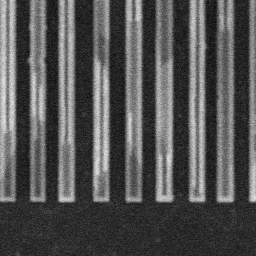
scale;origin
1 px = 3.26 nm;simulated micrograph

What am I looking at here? parallel lines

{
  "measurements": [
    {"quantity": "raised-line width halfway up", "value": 43.6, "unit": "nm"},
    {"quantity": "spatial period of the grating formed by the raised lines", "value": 0.102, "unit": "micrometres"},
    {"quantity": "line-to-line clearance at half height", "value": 0.0595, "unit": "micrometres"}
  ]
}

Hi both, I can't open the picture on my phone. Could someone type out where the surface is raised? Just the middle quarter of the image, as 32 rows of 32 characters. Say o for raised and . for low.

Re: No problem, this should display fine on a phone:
oo......ooo.....ooo.....ooo.....
oo......ooo.....ooo.....ooo.....
oo......ooo.....ooo.....ooo.....
oo......ooo.....ooo.....ooo.....
oo......ooo.....ooo.....ooo.....
oo......ooo.....ooo.....ooo.....
oo......ooo.....ooo.....ooo.....
oo......ooo.....ooo.....ooo.....
oo......ooo.....ooo.....ooo.....
oo......ooo.....ooo.....ooo.....
oo......ooo.....ooo.....ooo.....
oo......ooo.....ooo.....ooo.....
oo......ooo.....ooo.....ooo.....
oo......ooo.....ooo.....ooo.....
oo......ooo.....ooo.....ooo.....
oo......ooo.....ooo.....ooo.....
oo......ooo.....ooo.....ooo.....
oo......ooo.....ooo.....ooo.....
oo......ooo.....ooo.....ooo.....
oo......ooo.....ooo.....ooo.....
oo......ooo.....ooo.....ooo.....
oo......ooo.....ooo.....ooo.....
oo......ooo.....ooo.....ooo.....
oo......ooo.....ooo.....ooo.....
oo......ooo.....ooo.....ooo.....
oo......ooo.....ooo.....ooo.....
oo......ooo.....ooo.....ooo.....
oo......ooo.....ooo.....ooo.....
oo......ooo.....ooo.....ooo.....
oo......ooo.....ooo.....ooo.....
oo......ooo.....ooo.....ooo.....
oo......ooo.....ooo.....ooo.....